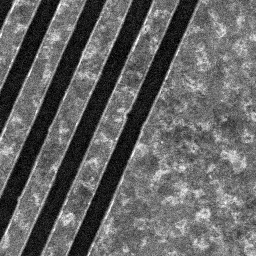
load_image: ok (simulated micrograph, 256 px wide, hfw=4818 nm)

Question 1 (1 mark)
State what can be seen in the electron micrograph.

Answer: parallel lines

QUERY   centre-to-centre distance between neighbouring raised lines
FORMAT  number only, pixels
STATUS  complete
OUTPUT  42.5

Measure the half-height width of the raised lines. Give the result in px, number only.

23.7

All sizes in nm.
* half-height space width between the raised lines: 357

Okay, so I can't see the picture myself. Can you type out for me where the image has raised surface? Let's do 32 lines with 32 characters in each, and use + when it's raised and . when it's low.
..+++..++++..+++...+++...+++++++
.+++...+++...+++...+++..++++++++
.+++...+++..+++...+++...++++++++
+++...+++...+++...+++..+++++++++
+++...+++..++++..+++...+++++++++
+++..+++...+++...+++...+++++++++
++...+++..++++..+++...++++++++++
++..+++...+++...+++...++++++++++
+...+++...+++..++++..+++++++++++
+..++++..+++...+++...+++++++++++
...+++...+++...+++..++++++++++++
..++++..+++...+++...++++++++++++
..+++...+++...+++...++++++++++++
..+++..++++..+++...+++++++++++++
.++++..+++...+++...+++++++++++++
.+++...+++..+++...++++++++++++++
++++..+++...+++...++++++++++++++
+++...+++...+++..+++++++++++++++
+++..+++...+++...+++++++++++++++
++...+++...+++..++++++++++++++++
++..+++...+++...++++++++++++++++
+...+++...+++...++++++++++++++++
+..++++..++++..+++++++++++++++++
...+++...+++...+++++++++++++++++
...+++..++++..++++++++++++++++++
..+++...+++...++++++++++++++++++
..+++...+++..+++++++++++++++++++
.++++..+++...+++++++++++++++++++
.+++...+++...+++++++++++++++++++
++++..+++...++++++++++++++++++++
+++...+++...++++++++++++++++++++
+++..++++..+++++++++++++++++++++